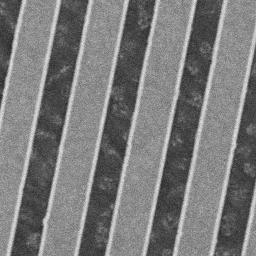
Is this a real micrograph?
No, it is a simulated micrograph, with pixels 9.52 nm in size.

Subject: one or a few lines or trenches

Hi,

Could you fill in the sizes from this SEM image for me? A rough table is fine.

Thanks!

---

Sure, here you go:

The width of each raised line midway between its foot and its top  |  334 nm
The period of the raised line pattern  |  0.631 um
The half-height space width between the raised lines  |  297 nanometres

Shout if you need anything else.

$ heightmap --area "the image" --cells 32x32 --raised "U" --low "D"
DDDUUUUDDDDUUUUUDDDDUUUUDDDDUUUU
DDDUUUUDDDDUUUUUDDDUUUUUDDDDUUUU
DDUUUUUDDDDUUUUDDDDUUUUUDDDDUUUU
DDUUUUUDDDDUUUUDDDDUUUUUDDDDUUUU
DDUUUUDDDDUUUUUDDDDUUUUDDDDUUUUU
DDUUUUDDDDUUUUUDDDDUUUUDDDDUUUUU
DDUUUUDDDDUUUUUDDDUUUUUDDDDUUUUD
DUUUUUDDDDUUUUDDDDUUUUUDDDDUUUUD
DUUUUUDDDDUUUUDDDDUUUUUDDDDUUUUD
DUUUUDDDDDUUUUDDDDUUUUDDDDUUUUUD
DUUUUDDDDUUUUUDDDDUUUUDDDDUUUUUD
DUUUUDDDDUUUUUDDDUUUUUDDDDUUUUDD
UUUUUDDDDUUUUDDDDUUUUUDDDDUUUUDD
UUUUUDDDDUUUUDDDDUUUUUDDDDUUUUDD
UUUUDDDDDUUUUDDDDUUUUDDDDUUUUUDD
UUUUDDDDUUUUUDDDDUUUUDDDDUUUUUDD
UUUUDDDDUUUUUDDDDUUUUDDDDUUUUDDD
UUUUDDDDUUUUDDDDUUUUUDDDDUUUUDDD
UUUUDDDDUUUUDDDDUUUUUDDDDUUUUDDD
UUUDDDDUUUUUDDDDUUUUDDDDUUUUUDDD
UUUDDDDUUUUUDDDDUUUUDDDDUUUUUDDD
UUUDDDDUUUUUDDDDUUUUDDDDUUUUDDDD
UUUDDDDUUUUDDDDUUUUUDDDDUUUUDDDD
UUUDDDDUUUUDDDDUUUUUDDDDUUUUDDDD
UUDDDDUUUUUDDDDUUUUDDDDUUUUUDDDD
UUDDDDUUUUUDDDDUUUUDDDDUUUUUDDDD
UUDDDDUUUUUDDDDUUUUDDDDUUUUDDDDD
UUDDDDUUUUDDDDUUUUUDDDDUUUUDDDDU
UUDDDDUUUUDDDDUUUUUDDDDUUUUDDDDU
UDDDDUUUUUDDDDUUUUDDDDUUUUUDDDDU
UDDDDUUUUUDDDDUUUUDDDDUUUUUDDDDU
UDDDDUUUUUDDDDUUUUDDDDUUUUDDDDDU